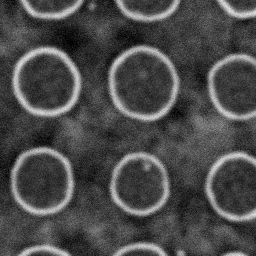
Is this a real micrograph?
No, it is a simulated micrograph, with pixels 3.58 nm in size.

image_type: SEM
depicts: raised bodies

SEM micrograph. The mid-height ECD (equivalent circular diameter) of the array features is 228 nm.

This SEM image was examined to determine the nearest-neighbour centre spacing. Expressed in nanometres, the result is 348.